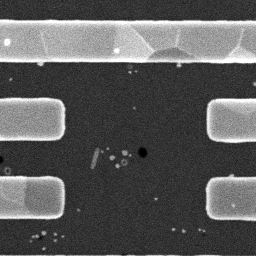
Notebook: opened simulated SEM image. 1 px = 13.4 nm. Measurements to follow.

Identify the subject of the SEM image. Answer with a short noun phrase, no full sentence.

wiring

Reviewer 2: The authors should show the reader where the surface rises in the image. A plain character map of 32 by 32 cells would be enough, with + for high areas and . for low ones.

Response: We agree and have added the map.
................................
................................
................................
++++++++++++++++++++++++++++++++
++++++++++++++++++++++++++++++++
++++++++++++++++++++++++++++++++
++++++++++++++++++++++++++++++++
++++++++++++++++++++++++++++++++
................................
................................
................................
................................
.+++++..........................
++++++++..................++++++
++++++++..................++++++
++++++++..................++++++
++++++++..................++++++
................................
................................
................................
................................
................................
+++++++....................+++++
++++++++..................++++++
++++++++..................++++++
++++++++..................++++++
++++++++..................++++++
................................
................................
................................
................................
................................